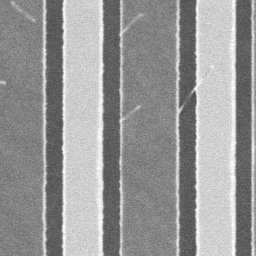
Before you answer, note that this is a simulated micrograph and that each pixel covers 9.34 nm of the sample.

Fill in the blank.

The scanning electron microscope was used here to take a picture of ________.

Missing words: lines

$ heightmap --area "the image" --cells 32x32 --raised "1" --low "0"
11111100111110011111110001111000
11111100111110011111110001111000
11111100111110011111110001111001
11111100111110011111110001111000
11111100111110011111110001111000
11111100111110011111110001111000
11111100111110011111110001111000
11111100111110011111110001111000
11111100111110011111110001111000
11111100111110011111110001111000
11111100111110011111110001111000
11111100111110011111110011111000
11111100111110011111110001111000
11111100111110011111110001111000
11111100111110011111110001111000
11111100111110011111110001111000
11111100111110011111110001111000
11111100111110011111110001111000
11111100111110011111110001111000
11111100111110011111110001111000
11111100111110011111110001111000
11111100111110011111110001111000
11111100111110011111110001111000
11111100111110011111110001111000
11111100111110011111110001111000
11111100111110011111110001111000
11111100111110011111110001111000
11111100111110011111110001111000
11111100111110011111110001111001
11111100111110011111110001111000
11111100111110011111110001111001
11111100111110011111110001111000